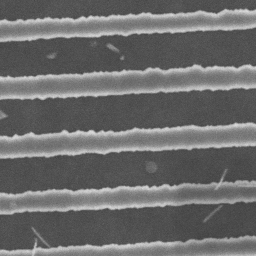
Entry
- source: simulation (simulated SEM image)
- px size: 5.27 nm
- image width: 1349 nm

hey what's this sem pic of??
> lines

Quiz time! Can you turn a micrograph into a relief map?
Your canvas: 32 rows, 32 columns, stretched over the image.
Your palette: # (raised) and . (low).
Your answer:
................................
............................####
..#.############################
################################
############....................
................................
................................
................................
.......................#########
.....###########################
################################
####################............
................................
................................
................................
.............................###
.........#####.#################
################################
########################........
#######.........................
................................
................................
................................
..............##################
################################
#######################.........
###.............................
................................
................................
................................
.................###############
################################